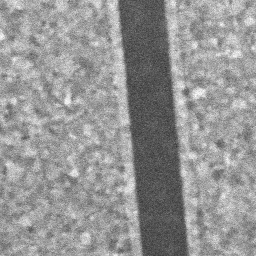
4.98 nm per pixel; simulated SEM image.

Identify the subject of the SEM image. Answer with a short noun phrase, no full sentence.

one or a few lines or trenches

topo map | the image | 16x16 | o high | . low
ooooooo....ooooo
ooooooo....ooooo
ooooooo....ooooo
ooooooo....ooooo
ooooooo....ooooo
oooooooo...ooooo
oooooooo...ooooo
oooooooo...ooooo
oooooooo...ooooo
oooooooo....oooo
oooooooo....oooo
oooooooo....oooo
oooooooo....oooo
oooooooo....oooo
oooooooo....oooo
oooooooo....oooo